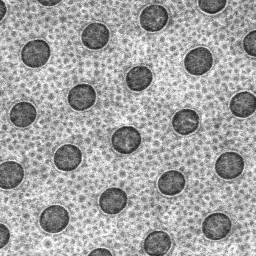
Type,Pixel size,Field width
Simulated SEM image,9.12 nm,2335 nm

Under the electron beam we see a regular array of holes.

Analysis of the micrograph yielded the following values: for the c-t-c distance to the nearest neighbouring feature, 557 nm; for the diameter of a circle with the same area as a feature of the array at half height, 260 nanometers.